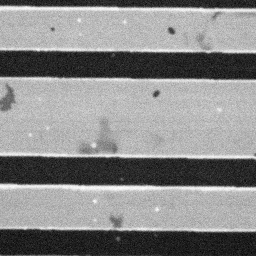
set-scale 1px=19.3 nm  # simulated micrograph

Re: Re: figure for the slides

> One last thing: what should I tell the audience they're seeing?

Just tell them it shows lines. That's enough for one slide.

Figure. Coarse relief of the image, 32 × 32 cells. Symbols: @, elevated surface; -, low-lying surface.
--------------------------------
@@@@@@@@@@@@@@@@@@@@@@@@@@@@@@@@
@@@@@@@@@@@@@@@@@@@@@@@@@@@@@@@@
@@@@@@@@@@@@@@@@@@@@@@@@@@@@@@@@
@@@@@@@@@@@@@@@@@@@@@@@@@@@@@@@@
@@@@@@@@@@@@@@@@@@@@@@@@@@@@@@@@
-------------------------@@@@@@@
--------------------------------
--------------------------------
--------------------------------
@@@@@@@@@@@@@@@@@@@@@@@@@@@@@@@@
@@@@@@@@@@@@@@@@@@@@@@@@@@@@@@@@
@@@@@@@@@@@@@@@@@@@@@@@@@@@@@@@@
@@@@@@@@@@@@@@@@@@@@@@@@@@@@@@@@
@@@@@@@@@@@@@@@@@@@@@@@@@@@@@@@@
@@@@@@@@@@@@@@@@@@@@@@@@@@@@@@@@
@@@@@@@@@@@@@@@@@@@@@@@@@@@@@@@@
@@@@@@@@@@@@@@@@@@@@@@@@@@@@@@@@
@@@@@@@@@@@@@@@@@@@@@@@@@@@@@@@@
--------@@@@@@@@@@@@@@@@@@@@@@@@
--------------------------------
--------------------------------
--------------------------------
@@@@@@@@@@@@@@@@@@@@@@@@@-------
@@@@@@@@@@@@@@@@@@@@@@@@@@@@@@@@
@@@@@@@@@@@@@@@@@@@@@@@@@@@@@@@@
@@@@@@@@@@@@@@@@@@@@@@@@@@@@@@@@
@@@@@@@@@@@@@@@@@@@@@@@@@@@@@@@@
@@@@@@@@@@@@@@@@@@@@@@@@@@@@@@@@
--------------------------------
--------------------------------
--------------------------------